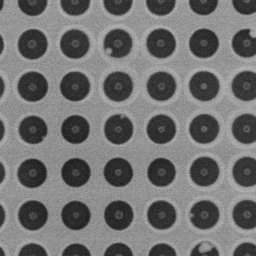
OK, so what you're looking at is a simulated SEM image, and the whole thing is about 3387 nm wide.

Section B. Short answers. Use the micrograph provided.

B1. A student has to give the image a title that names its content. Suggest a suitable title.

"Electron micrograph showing an array of small figures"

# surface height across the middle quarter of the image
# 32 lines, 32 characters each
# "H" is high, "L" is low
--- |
HHHHHHHHHHHHHHHHHHHHHHHHHHHHHHHH
HHLLHHHHHHHLLLLLHHHHHHLLLLHHHHHH
LLLLLLHHHHLLLLLLLHHHHLLLLLLLHHHH
LLLLLLHHHHLLLLLLLLHHLLLLLLLLHHHL
LLLLLLLHHLLLLLLLLLHHLLLLLLLLLHHL
LLHLLLLHHLLLLHLLLLHHLLLLHLLLLHLL
LLLLLLLHHLLLLLLLLLHHLLLLLLLLLHHL
LLLLLLHHHHLLLLLLLLHHLLLLLLLLHHHL
LLLLLLHHHHLLLLLLLHHHHLLLLLLLHHHH
HHLLHHHHHHHLLLLLHHHHHHHLLLHHHHHH
HHHHHHHHHHHHHHHHHHHHHHHHHHHHHHHH
HHHHHHHHHHHHHHHHHHHHHHHHHHHHHHHH
HHHHHHHHHHHHLLLLHHHHHHHLLLHHHHHH
HLLLLHHHHHLLLLLLLHHHHLLLLLLHHHHH
LLLLLLHHHHLLLLLLLHHHLLLLLLLLHHHL
LLLLLLLHHHLLLLLLLLHHLLLLLLLLHHHL
LLHLLLLHHHLLLHLLLLHHLLLLHLLLHHHL
LLLLLLHHHHLLLLLLLHHHLLLLLLLLHHHL
LLLLLLHHHHLLLLLLLHHHHLLLLLLLHHHL
HLLLLHHHHHHLLLLLHHHHHHLLLLLHHHHH
HHHHHHHHHHHHHHHHHHHHHHHHHHHHHHHH
HHHHHHHHHHHHHHHHHHHHHHHHHHHHHHHH
HHHHHHHHHHHHHHHHHHHHHHHHHHHHHHHH
HHHHHHHHHHHHLLLHHHHHHHHLLLHHHHHH
LLLLLLHHHHHLLLLLHHHHHHLLLLLHHHHH
LLLLLLHHHHLLLLLLLHHHHLLLLLLLHHHL
LLLLLLLHHHLLLLLLLHHHHLLLHLLLHHHL
LLHHLLLHHHLLLHLLLLHHHLLLHLLLHHHL
LLLLLLHHHHLLLLLLLHHHHLLLLLLLHHHL
LLLLLLHHHHHLLLLLLHHHHLLLLLLHHHHH
HLLLLHHHHHHHLLLHHHHHHHLLLLHHHHHH
HHHHHHHHHHHHHHHHHHHHHHHHHHHHHHHH